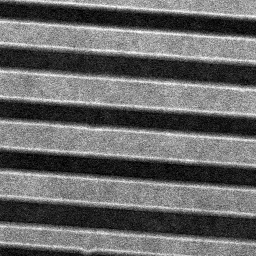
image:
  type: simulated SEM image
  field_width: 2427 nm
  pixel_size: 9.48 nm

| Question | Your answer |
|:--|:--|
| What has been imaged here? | parallel lines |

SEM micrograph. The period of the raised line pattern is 478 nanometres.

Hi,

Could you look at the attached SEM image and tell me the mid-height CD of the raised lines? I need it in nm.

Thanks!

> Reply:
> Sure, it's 284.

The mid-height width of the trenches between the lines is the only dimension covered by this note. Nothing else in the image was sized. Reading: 19.8 px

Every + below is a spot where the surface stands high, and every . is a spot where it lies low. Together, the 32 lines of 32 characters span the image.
.....+++++++++++++++++++++++++++
...................+++++++++++++
++..............................
++++++++++++++++................
++++++++++++++++++++++++++++++..
++++++++++++++++++++++++++++++++
..........++++++++++++++++++++++
.......................+++++++++
................................
+++++++++++++...................
++++++++++++++++++++++++++......
++++++++++++++++++++++++++++++++
..++++++++++++++++++++++++++++++
..............++++++++++++++++++
.............................+++
+++++++++.......................
++++++++++++++++++++++..........
++++++++++++++++++++++++++++++++
++++++++++++++++++++++++++++++++
...........+++++++++++++++++++++
........................++++++++
+++++...........................
++++++++++++++++++..............
++++++++++++++++++++++++++++++++
++++++++++++++++++++++++++++++++
.........+++++++++++++++++++++++
.......................+++++++++
................................
+++++++++.......................
+++++++++++++++++++++++.........
++++++++++++++++++++++++++++++++
..........++++++++++++++++++++++